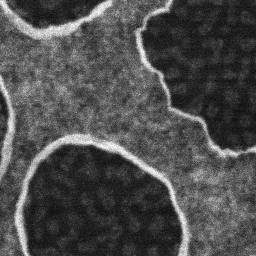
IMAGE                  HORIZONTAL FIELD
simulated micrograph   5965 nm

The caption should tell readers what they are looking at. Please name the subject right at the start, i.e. raised bodies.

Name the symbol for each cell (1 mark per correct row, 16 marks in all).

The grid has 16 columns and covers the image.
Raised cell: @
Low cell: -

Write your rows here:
@@@@@@----@@@@@@
-@@@@----@@@@@@@
---------@@@@@@@
---------@@@@@@@
----------@@@@@@
----------@@@@@@
@----------@@@@@
@-----------@@@@
@------------@@@
---@@@@@------@-
--@@@@@@@-------
--@@@@@@@@------
-@@@@@@@@@@-----
-@@@@@@@@@@-----
-@@@@@@@@@@@----
--@@@@@@@@@-----